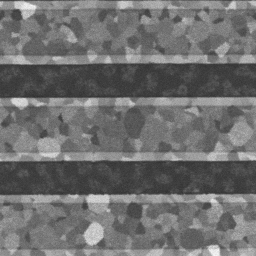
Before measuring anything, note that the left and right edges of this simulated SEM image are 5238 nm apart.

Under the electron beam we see one or a few lines or trenches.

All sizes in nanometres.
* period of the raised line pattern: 1980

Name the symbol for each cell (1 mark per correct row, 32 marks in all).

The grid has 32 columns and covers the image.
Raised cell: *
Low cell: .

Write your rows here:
.........****.*....*............
********************************
********************************
********************************
********************************
********************************
********************************
...********..............***....
................................
................................
................................
................................
................................
********************************
********************************
********************************
********************************
********************************
********************************
********************************
................................
................................
................................
................................
................................
********************************
********************************
********************************
********************************
********************************
********************************
********************************